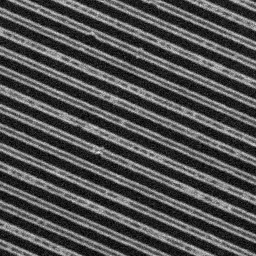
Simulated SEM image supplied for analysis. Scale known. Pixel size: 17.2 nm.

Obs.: parallel lines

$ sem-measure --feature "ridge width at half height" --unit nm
102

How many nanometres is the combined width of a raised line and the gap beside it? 304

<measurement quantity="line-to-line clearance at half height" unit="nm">207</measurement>